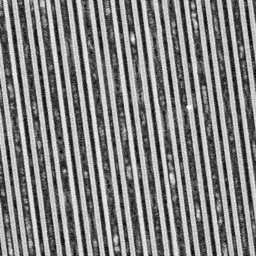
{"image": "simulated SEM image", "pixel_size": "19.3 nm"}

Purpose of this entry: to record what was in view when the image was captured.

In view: parallel lines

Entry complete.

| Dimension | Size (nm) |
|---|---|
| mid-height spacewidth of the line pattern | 100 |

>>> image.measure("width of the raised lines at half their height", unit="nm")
83.5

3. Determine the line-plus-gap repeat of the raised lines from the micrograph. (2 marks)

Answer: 205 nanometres